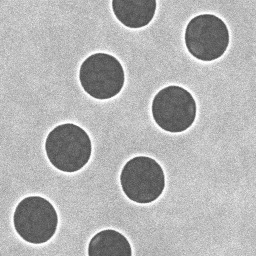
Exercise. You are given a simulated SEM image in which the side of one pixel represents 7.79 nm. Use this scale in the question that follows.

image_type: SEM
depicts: holes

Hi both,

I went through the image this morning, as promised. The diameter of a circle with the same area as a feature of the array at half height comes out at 0.358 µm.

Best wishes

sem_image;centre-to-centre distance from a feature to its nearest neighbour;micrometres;0.615